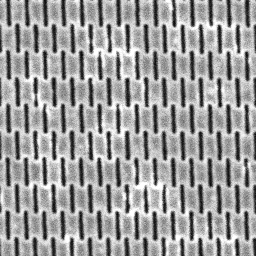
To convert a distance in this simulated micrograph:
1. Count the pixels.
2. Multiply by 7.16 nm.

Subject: a regular array of holes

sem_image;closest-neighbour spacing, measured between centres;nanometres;130